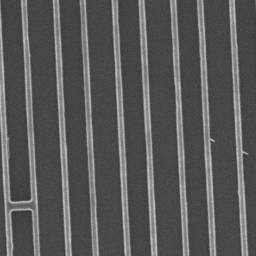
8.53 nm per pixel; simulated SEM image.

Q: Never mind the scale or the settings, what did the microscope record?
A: parallel lines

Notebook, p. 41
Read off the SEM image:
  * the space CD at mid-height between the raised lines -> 0.213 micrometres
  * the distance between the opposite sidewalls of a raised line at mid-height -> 0.0404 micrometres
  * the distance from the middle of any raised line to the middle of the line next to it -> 0.251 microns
